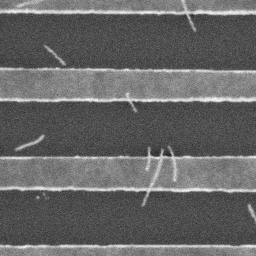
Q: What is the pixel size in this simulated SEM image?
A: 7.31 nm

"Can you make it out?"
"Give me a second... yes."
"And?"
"lines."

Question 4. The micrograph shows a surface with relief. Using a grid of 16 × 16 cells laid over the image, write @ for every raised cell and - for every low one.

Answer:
@@@@@@@@@@@@@@@@
----------------
----------------
----------------
@@@@@@@@@@@@@@@@
@@@@@@@@@@@@@@@@
----------------
----------------
----------------
----------------
@@@@@@@@@@@@@@@@
@@@@@@@@@@@@@@@@
----------------
----------------
----------------
@@@@@@@@@@@@@@@@